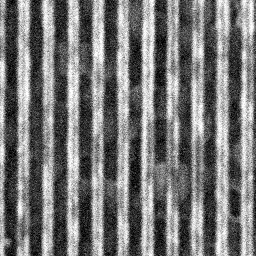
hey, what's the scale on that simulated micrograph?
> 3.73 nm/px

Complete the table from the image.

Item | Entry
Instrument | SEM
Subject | parallel lines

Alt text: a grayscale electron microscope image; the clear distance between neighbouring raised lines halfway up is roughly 62.1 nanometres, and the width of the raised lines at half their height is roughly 32.7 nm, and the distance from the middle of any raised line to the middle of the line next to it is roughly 92.9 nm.